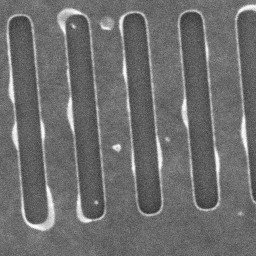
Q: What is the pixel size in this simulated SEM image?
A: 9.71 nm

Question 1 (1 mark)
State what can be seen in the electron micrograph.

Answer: groups of lines, slits or small figures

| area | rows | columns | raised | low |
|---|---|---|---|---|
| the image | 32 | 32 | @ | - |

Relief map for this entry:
@@@@@@@@@@@@@@@@@@@@@@@@@@@@@@@@
@@@@@@@@@@@@@@@@@@@@@@@--@@@@@--
@---@@@@---@@@@---@@@@---@@@@@--
@---@@@@---@@@@---@@@@----@@@@--
@---@@@@---@@@@---@@@@----@@@@--
@---@@@@---@@@@----@@@@---@@@@--
@---@@@@----@@@----@@@@---@@@@--
@---@@@@----@@@----@@@@---@@@@--
@----@@@----@@@@---@@@@---@@@@--
@----@@@@---@@@@---@@@@---@@@@--
@----@@@@---@@@@---@@@@---@@@@--
@----@@@@---@@@@---@@@@---@@@@--
@@---@@@@---@@@@---@@@@---@@@@--
@@---@@@@---@@@@---@@@@---@@@@--
@@---@@@@---@@@@---@@@@----@@@--
@@---@@@@---@@@@---@@@@----@@@--
@@---@@@@---@@@@----@@@@---@@@--
@@---@@@@---@@@@----@@@@---@@@@-
@@---@@@@----@@@@---@@@@---@@@@-
@@----@@@@---@@@@---@@@@---@@@@-
@@----@@@@---@@@@---@@@@---@@@@-
@@@---@@@@---@@@@---@@@@---@@@@-
@@@---@@@@---@@@@---@@@@---@@@@-
@@@---@@@@---@@@@---@@@@---@@@@-
@@@---@@@@---@@@@---@@@@---@@@@-
@@@---@@@@---@@@@---@@@@@--@@@@@
@@@---@@@@---@@@@@--@@@@@@@@@@@@
@@@---@@@@@-@@@@@@@@@@@@@@@@@@@@
@@@@@@@@@@@@@@@@@@@@@@@@@@@@@@@@
@@@@@@@@@@@@@@@@@@@@@@@@@@@@@@@@
@@@@@@@@@@@@@@@@@@@@@@@@@@@@@@@@
@@@@@@@@@@@@@@@@@@@@@@@@@@@@@@@@